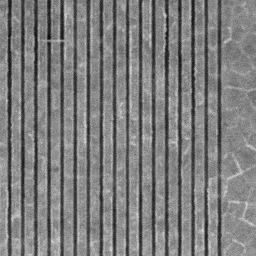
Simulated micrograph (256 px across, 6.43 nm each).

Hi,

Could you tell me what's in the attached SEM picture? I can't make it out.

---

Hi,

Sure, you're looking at parallel lines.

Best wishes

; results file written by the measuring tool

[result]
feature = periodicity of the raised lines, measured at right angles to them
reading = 13.1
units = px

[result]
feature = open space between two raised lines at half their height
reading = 26.5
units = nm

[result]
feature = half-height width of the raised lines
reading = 0.0579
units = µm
